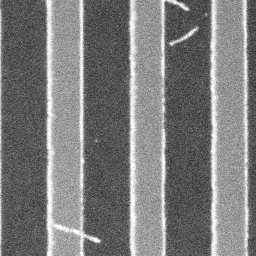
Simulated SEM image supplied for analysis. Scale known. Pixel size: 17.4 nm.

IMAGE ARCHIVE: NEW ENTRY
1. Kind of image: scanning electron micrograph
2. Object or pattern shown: lines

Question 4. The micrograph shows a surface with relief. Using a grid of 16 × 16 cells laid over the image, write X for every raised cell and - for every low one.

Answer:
---XX---XX---XX-
---XX---XX---XX-
---XX---XX---XX-
---XX---XX---XX-
---XX---XX---XX-
---XX---XX---XX-
---XX---XX---XX-
---XX---XX---XX-
---XX---XX---XX-
---XX---XX---XX-
---XX---XX---XX-
---XX---XX---XX-
---XX---XX---XX-
---XX---XX---XX-
---XX---XX---XX-
---XX---XX---XX-